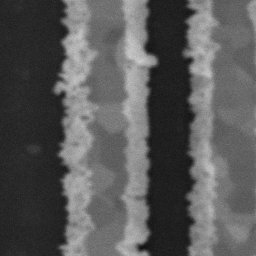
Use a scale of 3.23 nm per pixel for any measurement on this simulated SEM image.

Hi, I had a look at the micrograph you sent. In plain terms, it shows one or a few lines or trenches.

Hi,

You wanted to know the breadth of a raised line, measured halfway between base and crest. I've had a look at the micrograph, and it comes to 206 nanometers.